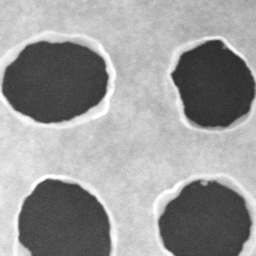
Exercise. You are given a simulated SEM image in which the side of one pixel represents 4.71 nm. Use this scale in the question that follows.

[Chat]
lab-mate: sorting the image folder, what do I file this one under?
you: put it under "holes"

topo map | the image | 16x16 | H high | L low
HHHHHHHHHHHHHHHH
HHHHHHHHHHHHHHHH
HHHLLHHHHHHHHHHH
HLLLLLHHHHHLLLLH
LLLLLLLHHHHLLLLL
LLLLLLLHHHHLLLLL
HLLLLLHHHHHLLLLL
HHLLHHHHHHHHLLLH
HHHHHHHHHHHHHHHH
HHHHHHHHHHHHHHHH
HHHHHHHHHHHHHHHH
HHLLLHHHHHHHLLLH
HHLLLLHHHHHLLLLH
HLLLLLLHHHLLLLLL
HLLLLLLHHHLLLLLL
HLLLLLLHHHLLLLLH